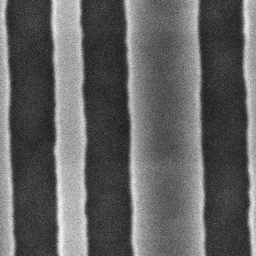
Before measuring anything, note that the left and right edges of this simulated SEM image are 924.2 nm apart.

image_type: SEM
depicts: lines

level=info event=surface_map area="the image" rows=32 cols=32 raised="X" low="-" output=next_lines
X------XXX------XXXXXXXXX------X
X------XXX------XXXXXXXXX------X
X------XXX------XXXXXXXXX------X
X------XXX------XXXXXXXXX------X
X------XXX------XXXXXXXXX------X
X------XXX------XXXXXXXXX------X
X------XXX------XXXXXXXXX------X
X------XXX------XXXXXXXXX------X
X------XXX------XXXXXXXXX------X
X------XXX------XXXXXXXXX------X
X------XXX------XXXXXXXXX------X
X------XXX------XXXXXXXXX------X
X------XXX------XXXXXXXXX------X
X------XXX------XXXXXXXXX------X
X------XXX------XXXXXXXXX------X
X------XXXX-----XXXXXXXXX------X
X------XXXX-----XXXXXXXXX------X
X------XXXX-----XXXXXXXXX------X
X------XXXX-----XXXXXXXXX------X
X------XXX------XXXXXXXXX------X
X------XXX------XXXXXXXXX------X
X------XXX------XXXXXXXXX------X
X------XXX-------XXXXXXXX------X
X------XXX-------XXXXXXXX------X
X------XXXX------XXXXXXXX------X
X------XXX-------XXXXXXXX------X
X------XXX-------XXXXXXXX------X
X------XXXX------XXXXXXXX------X
XX------XXX------XXXXXXXX------X
XX------XXX------XXXXXXXX-------
XX------XXX------XXXXXXXX-------
XX------XXX------XXXXXXXXX------